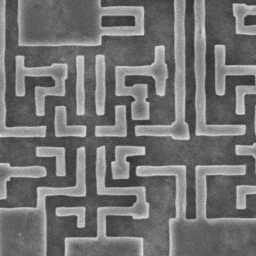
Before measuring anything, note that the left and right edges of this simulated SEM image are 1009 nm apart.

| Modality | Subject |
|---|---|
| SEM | wiring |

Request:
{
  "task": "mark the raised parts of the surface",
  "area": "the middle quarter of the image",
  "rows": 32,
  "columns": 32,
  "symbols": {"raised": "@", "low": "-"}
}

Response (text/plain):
@--@@---@@-----------@@@@---@@--
@--@@---@@---@@@@@@@@@@@@@--@@--
@--@@---@@---@@@@@@@@@@@@@--@@--
@--@@---@@---@@--------@@@--@@--
---@@---@@---@@--------@@---@@--
---@@---@@---@@---@@@--@@---@@--
---@@---@@---@@@@@@@@--@@---@@--
---@@---@@---@@@@@@@@--@@---@@--
---@@---@@--------@@--------@@--
---@@---@@-------@@@@-------@@--
---@@---@@-------@@@@-------@@--
---@@---@@---@@--@@@@-------@@--
---@@---@@---@@--@@@@-------@@--
-------------@@--@@@@-------@@--
-------------@@-------------@@--
@-----------@@@-------@@--@@@@@-
@@@@@---@@@@@@@---@@@@@@@@@@@@@-
@@@@@---@@@@@@@---@@@@@@@@@@@@@-
---------------------------@@@@-
--------------------------------
--------------------------------
---@@---@@---@@@@@@@------------
---@@---@@---@@@@@@@------------
---@@---@@---@@-----------------
---@@---@@--@@@@----------------
---@@---@@--@@@@----------------
---@@---@@--@@@@--@@@@@@@@@@@@--
---@@---@@--@@@@--@@@@@@@@@@@@--
---@@---@@--@@@@------------@@--
---@@---@@------------------@@--
---@@---@@------------------@@--
@@@@@---@@@@@@@@@@@@--------@@--